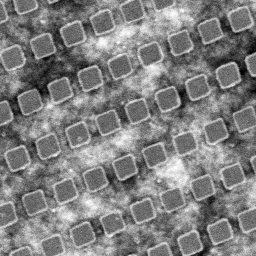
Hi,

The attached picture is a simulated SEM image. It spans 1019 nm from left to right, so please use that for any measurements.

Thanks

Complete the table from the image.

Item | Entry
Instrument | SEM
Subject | a regular array of raised bodies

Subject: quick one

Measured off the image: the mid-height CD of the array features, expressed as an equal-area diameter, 92.7 nm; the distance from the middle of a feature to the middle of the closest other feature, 128 nanometres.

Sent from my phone